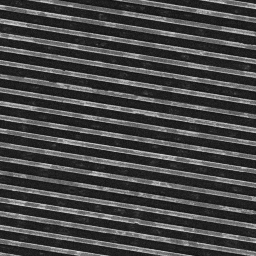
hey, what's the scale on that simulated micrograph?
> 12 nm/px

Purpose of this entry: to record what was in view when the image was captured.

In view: parallel lines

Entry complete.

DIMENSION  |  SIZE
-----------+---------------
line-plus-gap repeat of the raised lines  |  0.163 microns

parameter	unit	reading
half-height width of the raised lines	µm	0.049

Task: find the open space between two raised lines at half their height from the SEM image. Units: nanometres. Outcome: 108